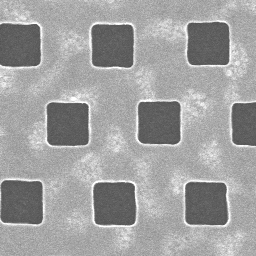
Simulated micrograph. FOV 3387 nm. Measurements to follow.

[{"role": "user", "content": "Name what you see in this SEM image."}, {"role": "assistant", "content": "holes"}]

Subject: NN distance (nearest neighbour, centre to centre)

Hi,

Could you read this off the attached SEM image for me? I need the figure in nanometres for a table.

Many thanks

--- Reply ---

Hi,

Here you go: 1200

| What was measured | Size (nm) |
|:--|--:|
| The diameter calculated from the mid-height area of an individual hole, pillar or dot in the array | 630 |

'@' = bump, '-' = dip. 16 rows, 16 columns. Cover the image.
@@@@@@@@@@@@@@@@
-@@@@@@@@@@@--@@
---@@@--@@@@--@@
---@@@--@@@@--@@
@@@@@@@@@@@@@@@@
@@@@@@@@@@@@@@@@
@@@--@@@@--@@@@-
@@@---@@@--@@@--
@@@---@@@--@@@@-
@@@@@@@@@@@@@@@@
@@@@@@@@@@@@@@@@
--@@@@--@@@@--@@
---@@@--@@@@--@@
---@@@--@@@@--@@
@@@@@@@@@@@@@@@@
@@@@@@@@@@@@@@@@